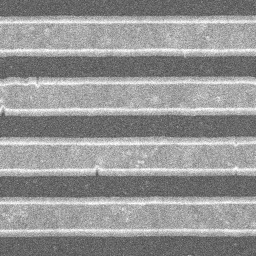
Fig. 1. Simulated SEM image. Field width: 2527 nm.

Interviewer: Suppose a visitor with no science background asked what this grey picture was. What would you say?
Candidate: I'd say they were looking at parallel lines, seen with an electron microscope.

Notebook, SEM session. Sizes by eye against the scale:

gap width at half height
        276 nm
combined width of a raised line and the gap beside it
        60.2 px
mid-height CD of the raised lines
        311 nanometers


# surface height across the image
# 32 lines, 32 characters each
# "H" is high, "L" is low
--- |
LLLLLLLLLLLLLLLLLLLLLLLLLLLLLLLL
LLLLLLLLLLLLLLLLLLLLLLLLLLLLLLLL
LHHLHHHHHHHHHLHHLLHLHHHHLLHHHLLL
HHHHHHHHHHHHHHHHHHHHHHHHHHHHHHHH
HHHHHHHHHHHHHHHHHHHHHHHHHHHHHHHH
HHHHHHHHHHHHHHHHHHHHHHHHHHHHHHHH
HHHHHHHHHHHHHHHHHLLLLLHHHHHHHHHH
LLLLLLLLLLLLLLLLLLLLLLLLLLLLLLLL
LLLLLLLLLLLLLLLLLLLLLLLLLLLLLLLL
LLLLLLLLLLLLLLLLLLLLLLLLLLLLLLLL
HHHHHHHHHHHHHHHHHHHHHHHHHHHHHHHH
HHHHHHHHHHHHHHHHHHHHHHHHHHHHHHHH
HHHHHHHHHHHHHHHHHHHHHHHHHHHHHHHH
HHHHHHHHHHHHHHHHHHHHHHHHHHHHHHHH
LLLLLLLLLLLLLLLLLLLLLLLLLLLLLLLL
LLLLLLLLLLLLLLLLLLLLLLLLLLLLLLLL
LLLLLLLLLLLLLLLLLLLLLLLLLLLLLLLL
LLLLLLLLLLLLLLLLLLLLLLLLLLLLLLLL
HHHHHHHHHHHHHHHHHHHHHHHHHHHHHHHH
HHHHHHHHHHHHHHHHHHHHHHHHHHHHHHHH
HHHHHHHHHHHHHHHHHHHHHHHHHHHHHHHH
LLHHHLLLLLLLLLLHLLLLLHHHHHHLLLHH
LLLLLLLLLLLLLLLLLLLLLLLLLLLLLLLL
LLLLLLLLLLLLLLLLLLLLLLLLLLLLLLLL
LLLLLLLLLLLLLLLLLLLLLLLLLLLLLLLL
HHHHHHHHHHHHHHHHHHHHHHHHHHHHHHHH
HHHHHHHHHHHHHHHHHHHHHHHHHHHHHHHH
HHHHHHHHHHHHHHHHHHHHHHHHHHHHHHHH
HHHHHHHHHHHHHHHHHHHHHHHHHHHHHHHH
LLLLLLLLLLLLLLLLLLLLLLLLLLLLLLLL
LLLLLLLLLLLLLLLLLLLLLLLLLLLLLLLL
LLLLLLLLLLLLLLLLLLLLLLLLLLLLLLLL